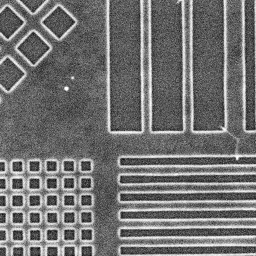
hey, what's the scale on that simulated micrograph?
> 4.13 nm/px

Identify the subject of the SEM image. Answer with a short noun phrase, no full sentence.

groups of lines, slits or small figures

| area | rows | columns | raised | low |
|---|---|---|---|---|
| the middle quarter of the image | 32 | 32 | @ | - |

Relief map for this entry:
@@@@@@@@@@@--------@@@--------@@
@@@@@@@@@@@--------@@@--------@@
@@@@@@@@@@@--------@@@--------@@
@@@@@@@@@@@--------@@@--------@@
@@@@@@@@@@@--------@@@--------@@
@@@@@@@@@@@--------@@@--------@@
@@@@@@@@@@@--------@@@--------@@
@@@@@@@@@@@--------@@@--------@@
@@@@@@@@@@@--------@@@--------@@
@@@@@@@@@@@--------@@@--------@@
@@@@@@@@@@@--------@@@--------@@
@@@@@@@@@@@---------@@--------@@
@@@@@@@@@@@---------@@--------@@
@@@@@@@@@@@---------@@--------@@
@@@@@@@@@@@---------@@--------@@
@@@@@@@@@@@---------@@--------@@
@@@@@@@@@@@@-------@@@--------@@
@@@@@@@@@@@@@@@@@@@@@@@@@@@@@@@@
@@@@@@@@@@@@@@@@@@@@@@@@@@@@@@@@
@@@@@@@@@@@@@@@@@@@@@@@@@@@@@@@@
@@@@@@@@@@@@@@@@@@@@@@@@@@@@@@@@
@@@@@@@@@@@@@@@@@@@@@@@@@@@@@@@@
@@@@@@@@@@@@@@@@@@@@@@@@@@@@@@@@
@@@@@@@@@@@@@@------------------
--@@---@@@@@@@------------------
---@---@@@@@@@@---@@@@@@@@@@@@@@
--@@---@@@@@@@@@@@@@@@@@@@@@@@@@
@@@@@@@@@@@@@@@@@@@@@@@@@@@@@@@@
--@@@-@@@@@@@@------------------
---@---@@@@@@@------------------
---@---@@@@@@@@@@@@@@@@@@@@@@@@@
@@@@@@@@@@@@@@@@@@@@@@@@@@@@@@@@